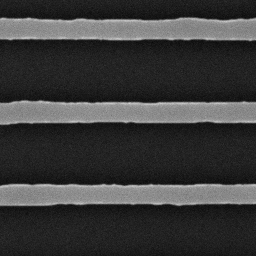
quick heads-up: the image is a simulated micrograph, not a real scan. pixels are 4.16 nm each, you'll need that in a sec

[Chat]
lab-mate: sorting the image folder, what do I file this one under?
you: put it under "lines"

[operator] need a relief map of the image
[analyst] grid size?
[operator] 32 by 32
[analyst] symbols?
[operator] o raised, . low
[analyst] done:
................................
................................
ooooo....oo...........oooo...ooo
oooooooooooooooooooooooooooooooo
oooooooooooooooooooooooooooooooo
................................
................................
................................
................................
................................
................................
................................
................................
oooooooooooooooooooooooooooooooo
oooooooooooooooooooooooooooooooo
oo..............................
................................
................................
................................
................................
................................
................................
................................
oooooooooooooooooooooooooooooooo
oooooooooooooooooooooooooooooooo
ooooooo..oo........oooooo.......
................................
................................
................................
................................
................................
................................